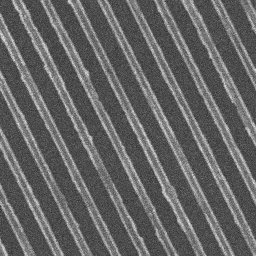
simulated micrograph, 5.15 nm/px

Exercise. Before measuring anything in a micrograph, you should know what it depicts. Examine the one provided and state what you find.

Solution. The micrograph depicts parallel lines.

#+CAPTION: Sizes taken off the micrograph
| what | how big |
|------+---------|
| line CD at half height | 47.8 nm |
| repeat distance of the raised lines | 131 nm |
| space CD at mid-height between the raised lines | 82.5 nanometers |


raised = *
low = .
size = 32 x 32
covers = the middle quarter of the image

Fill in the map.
..***....***.....**.....**.....*
...***....**.....**.....***....*
...***....***.....**....***.....
....**.....**.....***....***....
....***....***.....**....***....
.....**.....**.....***....***...
*....***....***.....**.....**...
*.....**.....**.....***....***..
**....**.....***.....**.....**..
**.....**.....**.....**.....***.
***....***....***.....**.....**.
.**.....**.....**.....***....***
.***....***....***.....**.....**
..**.....**.....**.....***....**
..***....***....***.....**.....*
...**.....**.....**.....***....*
...***....***....***.....**.....
....**.....**.....**.....***....
....***....***....***.....**....
....***.....**.....**.....***...
.....***....***....***.....**...
*....***.....**.....**.....***..
*.....***....***....***.....**..
**....***.....**.....**.....***.
**.....***....***....***.....**.
.**.....**.....**.....**.....***
.**.....***....***....***.....**
.***.....**.....**.....**.....**
..**.....***....***....***.....*
..***.....**.....**.....**.....*
...**.....***....***....***.....
...***.....**.....**.....***....